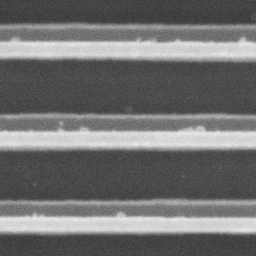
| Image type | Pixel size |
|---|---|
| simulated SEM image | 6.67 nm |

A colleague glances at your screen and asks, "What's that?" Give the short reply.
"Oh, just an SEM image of lines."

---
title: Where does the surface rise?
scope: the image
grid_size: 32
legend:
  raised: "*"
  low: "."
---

................................
................................
................................
********************************
********************************
********************************
********************************
................................
................................
................................
................................
................................
................................
................................
................................
********************************
********************************
********************************
................................
................................
................................
................................
................................
................................
................................
********************************
********************************
********************************
********************************
................................
................................
................................